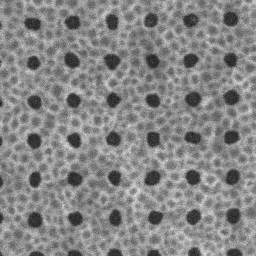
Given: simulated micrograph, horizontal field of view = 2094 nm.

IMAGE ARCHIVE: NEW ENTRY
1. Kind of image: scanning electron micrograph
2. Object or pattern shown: a regular array of holes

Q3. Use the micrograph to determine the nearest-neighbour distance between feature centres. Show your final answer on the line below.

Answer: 316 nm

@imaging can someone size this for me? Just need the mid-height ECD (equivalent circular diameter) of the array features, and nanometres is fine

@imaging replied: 132